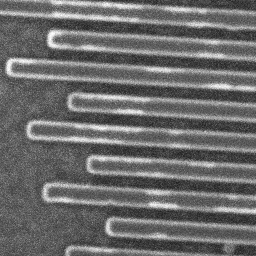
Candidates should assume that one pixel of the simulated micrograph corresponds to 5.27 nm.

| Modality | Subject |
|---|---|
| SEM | parallel lines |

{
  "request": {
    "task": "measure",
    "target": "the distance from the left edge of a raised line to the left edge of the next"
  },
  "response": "161 nm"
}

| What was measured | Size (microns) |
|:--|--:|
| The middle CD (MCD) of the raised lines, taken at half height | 0.0874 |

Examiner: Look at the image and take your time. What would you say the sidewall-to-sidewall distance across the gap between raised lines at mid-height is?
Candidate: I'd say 77.5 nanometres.